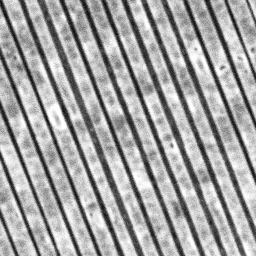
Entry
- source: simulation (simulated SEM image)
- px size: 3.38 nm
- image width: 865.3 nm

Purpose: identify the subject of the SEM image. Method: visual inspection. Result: parallel lines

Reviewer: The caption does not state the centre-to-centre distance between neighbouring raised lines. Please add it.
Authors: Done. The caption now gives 64.6 nm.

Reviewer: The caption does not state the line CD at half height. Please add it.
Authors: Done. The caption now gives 42.9 nm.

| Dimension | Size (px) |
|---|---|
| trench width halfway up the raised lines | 6.27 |